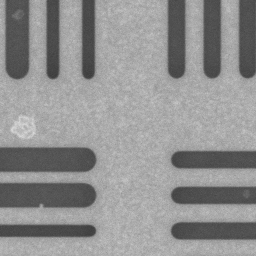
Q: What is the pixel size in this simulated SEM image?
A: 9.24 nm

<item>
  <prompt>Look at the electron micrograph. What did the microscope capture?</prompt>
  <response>groups of lines, slits or small figures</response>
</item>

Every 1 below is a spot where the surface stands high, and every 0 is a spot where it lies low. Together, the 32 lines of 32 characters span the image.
10001100110011111111100110001100
10001100110011111111100110001100
10001100110011111111100110001100
10001101110011111111100110001100
10001101110011111111100110001100
10001101110011111111100110001100
10001101110011111111100110001100
10001101110011111111100110001100
10001101110011111111100110001100
10011101110011111111100111011100
11111111111111111111111111111111
11111111111111111111111111111111
11111111111111111111111111111111
11111111111111111111111111111111
11111111111111111111111111111111
11111111111111111111111111111111
11111111111111111111111111111111
11111111111111111111111111111111
00000000000111111111111111111111
00000000000011111111110000000000
00000000000011111111110000000000
00000000000111111111111111111111
11111111111111111111111111111111
00000000000011111111110000000000
00000000000011111111100000000000
00000000000011111111111000000000
11111111111111111111111111111111
11111111111111111111111111111111
00000000000011111111100000000000
00000000000011111111110000000000
11111111111111111111111111111111
11111111111111111111111111111111